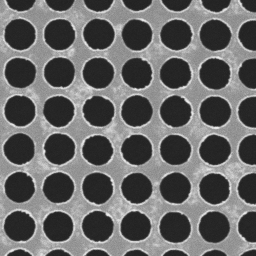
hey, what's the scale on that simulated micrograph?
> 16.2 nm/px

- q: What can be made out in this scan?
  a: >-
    a regular array of holes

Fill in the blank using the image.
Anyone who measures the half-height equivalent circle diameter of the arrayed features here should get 0.511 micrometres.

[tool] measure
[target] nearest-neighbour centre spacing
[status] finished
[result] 618 nanometers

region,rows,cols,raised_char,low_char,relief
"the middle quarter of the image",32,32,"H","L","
LLHHHLLLLLLLHHHLLLLLLLHHHLLLLLLH
LLLHHLLLLLLLLHLLLLLLLLHHLLLLLLLL
LLLHLLLLLLLLLHLLLLLLLLHHLLLLLLLL
LLHHHLLLLLLLHHHLLLLLLLHHLLLLLLLL
LLHHHLLLLLLLHHHLLLLLLLHHLLLLLLLH
LHHHHHLLLLLHHHHHLLLLLHHHHLLLLLHH
HHHHHHHHHHHHHHHHHHHHHHHHHHHHHHHH
HHHHHHHHHHHHHHHHHHHHHHHHHHHHHHHH
LHHHHHLLLLHHHHHHLLLLLHHHHHLLLLHH
LLHHHLLLLLLLHHHLLLLLLLHHHLLLLLLH
LLHHHLLLLLLLLHHLLLLLLLHHLLLLLLLL
LLLHLLLLLLLLLHLLLLLLLLHHLLLLLLLL
LLLHHLLLLLLLLHLLLLLLLLHHLLLLLLLL
LLHHHLLLLLLLHHHLLLLLLLHHLLLLLLLL
LLHHHHLLLLLLHHHLLLLLLHHHHLLLLLLH
HHHHHHHHLLHHHHHHHLLHHHHHHHLLLLHH
HHHHHHHHHHHHHHHHHHHHHHHHHHHHHHHH
HHHHHHHHHHHHHHHHHLLHHHHHHHHHHHHH
LLHHHHLLLLLHHHHHLLLLLHHHHLLLLLHH
LLLHHLLLLLLLHHHLLLLLLHHHLLLLLLLH
LLLHHLLLLLLLHHLLLLLLLLHHLLLLLLLL
LLLHLLLLLLLLHHLLLLLLLLHHLLLLLLLL
LLLHHLLLLLLLHHLLLLLLLLHHLLLLLLLL
LLHHHLLLLLLLHHHLLLLLLLHHLLLLLLLH
LHHHHHLLLLLHHHHHLLLLLHHHHLLLLLLH
HHHHHHHHLHHHHHHHHHHHHHHHHHHHHHHH
HHHHHHHHHHHHHHHHHHHHHHHHHHHHHHHH
HHHHHHHLLLHHHHHHHLLLHHHHHHLLLLHH
LLHHHLLLLLLLHHHLLLLLLHHHHLLLLLLH
LLHHHLLLLLLLHHLLLLLLLLHHLLLLLLLL
LLLHLLLLLLLLHHLLLLLLLLHHLLLLLLLL
LLLHHLLLLLLLHHLLLLLLLLHHLLLLLLLL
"